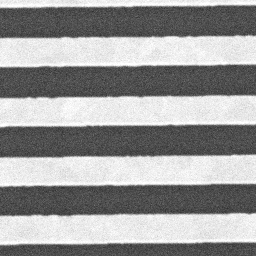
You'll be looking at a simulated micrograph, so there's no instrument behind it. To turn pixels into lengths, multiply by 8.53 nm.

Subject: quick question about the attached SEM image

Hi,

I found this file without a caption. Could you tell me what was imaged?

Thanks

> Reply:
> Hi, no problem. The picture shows lines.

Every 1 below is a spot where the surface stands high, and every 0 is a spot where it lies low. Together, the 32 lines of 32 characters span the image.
11111111111111111111111111111111
00000000000000000000000000000000
00000000000000000000000000000000
00000000000000000000000000000000
00000000000000000000000000000000
11111111111111111111111111111111
11111111111111111111111111111111
11111111111111111111111111111111
00000000000000000000000000000000
00000000000000000000000000000000
00000000000000000000000000000000
00000000000000000000000000000000
11111111111111111111111111111111
11111111111111111111111111111111
11111111111111111111111111111111
11111111111111111111100000000000
00000000000000000000000000000000
00000000000000000000000000000000
00000000000000000000000000000000
00000000000000000000000000000111
11111111111111111111111111111111
11111111111111111111111111111111
11111111111111111111111111111111
00000000000000000000000000000000
00000000000000000000000000000000
00000000000000000000000000000000
00000000000000000000000000000000
11111111111111111111111111111111
11111111111111111111111111111111
11111111111111111111111111111111
00000000000000000000000000000000
00000000000000000000000000000000